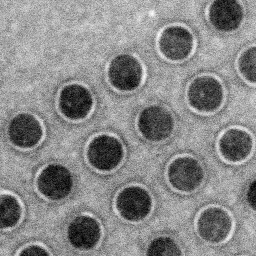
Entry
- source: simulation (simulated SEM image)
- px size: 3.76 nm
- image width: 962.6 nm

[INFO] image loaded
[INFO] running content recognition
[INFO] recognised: a regular array of raised bodies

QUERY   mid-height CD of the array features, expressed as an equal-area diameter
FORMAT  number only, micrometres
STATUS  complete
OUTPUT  0.149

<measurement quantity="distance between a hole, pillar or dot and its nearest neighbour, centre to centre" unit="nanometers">218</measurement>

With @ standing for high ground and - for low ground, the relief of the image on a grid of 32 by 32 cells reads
--------------------------@@@@--
--------------------------@@@@@-
--------------------------@@@@--
--------------------@@@@---@@@--
--------------------@@@@--------
--------------------@@@@--------
--------------------@@@@------@@
--------------@@@@---@@-------@@
-------------@@@@@------------@@
-------------@@@@@-------@@---@@
--------@@----@@@@------@@@@---@
-------@@@@----@@------@@@@@----
-------@@@@@-----------@@@@@----
-------@@@@@------@@@---@@@@----
--@@@---@@@------@@@@@----------
-@@@@------------@@@@@----------
-@@@@@-----------@@@@@------@@@-
-@@@@------@@@@---@@@------@@@@@
--@@-------@@@@@-----------@@@@@
-----------@@@@@------@@---@@@@-
------@@---@@@@------@@@@-------
-----@@@@---@@-------@@@@@------
----@@@@@------------@@@@@------
----@@@@@------@@@---@@@@------@
@@---@@@@-----@@@@@------------@
@@@-----------@@@@@------------@
@@@-----------@@@@@------@@@@---
@@@------@@@---@@@------@@@@@---
@@------@@@@@-----------@@@@@---
--------@@@@@-------@----@@@@---
---@@----@@@------@@@@----@@----
--@@@@----@-------@@@@@---------